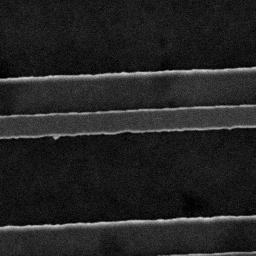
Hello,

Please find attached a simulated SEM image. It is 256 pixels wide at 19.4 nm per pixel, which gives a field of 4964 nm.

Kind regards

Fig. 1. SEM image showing lines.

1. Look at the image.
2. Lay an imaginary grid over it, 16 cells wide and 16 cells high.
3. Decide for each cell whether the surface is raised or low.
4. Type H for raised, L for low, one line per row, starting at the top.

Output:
LLLLLLLLLLLLLLLL
LLLLLLLLLLLLLLLL
LLLLLLLLLLLLLLLL
LLLLLLLLLLLLLLLL
LLLLLLLLLLHHHHHH
HHHHHHHHHHHHHHHH
HHHHHHHHHHHHHHHH
HHHHHHHHHHHHHHHH
HHHHLLLLLLLLLLLL
LLLLLLLLLLLLLLLL
LLLLLLLLLLLLLLLL
LLLLLLLLLLLLLLLL
LLLLLLLLLLLLLLLL
LLLLLLLLLLLLLLLH
HHHHHHHHHHHHHHHH
HHHHHHHHHHHHHHHH